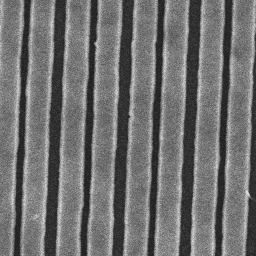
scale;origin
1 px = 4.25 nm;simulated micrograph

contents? parallel lines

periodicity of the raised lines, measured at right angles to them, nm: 143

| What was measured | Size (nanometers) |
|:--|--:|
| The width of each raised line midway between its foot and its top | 93.5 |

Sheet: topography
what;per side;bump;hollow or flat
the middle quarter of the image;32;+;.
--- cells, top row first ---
++++++..+++++....+++++...+++++..
++++++..+++++....++++++..+++++..
++++++..+++++....++++++..+++++..
++++++..+++++....+++++...+++++..
++++++..+++++....+++++...+++++..
+++++...+++++....+++++...+++++..
+++++...+++++....+++++...+++++..
+++++...+++++....+++++...+++++..
+++++...+++++....+++++...+++++..
+++++...+++++....+++++...+++++..
+++++...+++++....+++++...+++++..
+++++...+++++....+++++...+++++..
+++++...+++++....+++++...+++++..
+++++...+++++....+++++..++++++..
+++++...+++++....+++++..+++++...
+++++...+++++....+++++..+++++...
+++++...+++++...++++++..++++++..
+++++...+++++...++++++..++++++..
+++++..++++++...++++++..+++++...
+++++..++++++...++++++..+++++...
+++++..++++++...++++++..+++++...
+++++..++++++...++++++..+++++...
+++++..+++++....+++++...+++++...
+++++..+++++....++++++..+++++...
+++++..+++++....++++++..+++++...
+++++..+++++....++++++..+++++...
+++++..+++++....++++++..+++++...
+++++..+++++....++++++..+++++...
+++++..+++++....+++++...+++++...
++++...+++++....+++++...+++++...
+++++..+++++....+++++...+++++...
+++++..+++++....+++++...+++++...